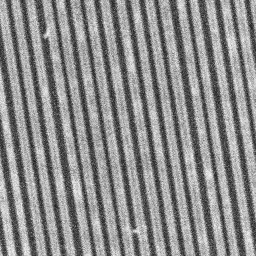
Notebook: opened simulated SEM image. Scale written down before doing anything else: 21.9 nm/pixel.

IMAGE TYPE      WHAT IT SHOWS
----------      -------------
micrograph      parallel lines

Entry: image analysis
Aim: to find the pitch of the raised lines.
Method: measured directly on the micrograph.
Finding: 323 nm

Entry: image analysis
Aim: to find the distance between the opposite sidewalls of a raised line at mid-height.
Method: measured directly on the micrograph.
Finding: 152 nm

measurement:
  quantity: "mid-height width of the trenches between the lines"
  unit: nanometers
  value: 173